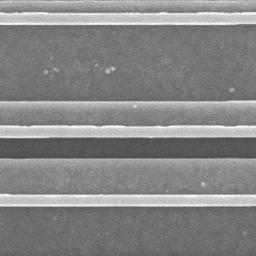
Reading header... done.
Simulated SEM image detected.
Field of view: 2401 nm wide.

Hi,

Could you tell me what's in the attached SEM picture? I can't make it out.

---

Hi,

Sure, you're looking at lines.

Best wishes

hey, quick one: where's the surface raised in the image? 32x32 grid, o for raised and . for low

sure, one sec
oooooooooooooooooooooooooooooooo
oooooooooooooooooooooooooooooooo
oooooooooooooooooooooooooooooooo
................................
................................
................................
................................
................................
................................
................................
................................
................................
................................
oooooooooooooooooooooooooooooooo
oooooooooooooooooooooooooooooooo
oooooooooooooooooooooooooooooooo
oooooooooooooooooooooooooooooooo
................................
................................
................................
oooooooooooooooooooooooooooooooo
oooooooooooooooooooooooooooooooo
oooooooooooooooooooooooooooooooo
oooooooooooooooooooooooooooooooo
oooooooooooooooooooooooooooooooo
oooooooooooooooooooooooooooooooo
................................
................................
................................
................................
................................
................................